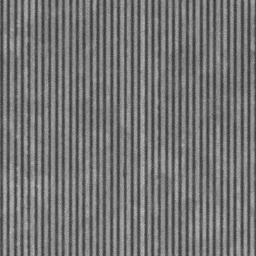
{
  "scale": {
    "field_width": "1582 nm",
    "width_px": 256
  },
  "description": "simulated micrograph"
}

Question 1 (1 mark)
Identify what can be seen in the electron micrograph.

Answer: parallel lines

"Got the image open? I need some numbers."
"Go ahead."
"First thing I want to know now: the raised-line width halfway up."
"18.5 nm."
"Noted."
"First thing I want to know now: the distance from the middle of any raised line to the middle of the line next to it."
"42.5 nm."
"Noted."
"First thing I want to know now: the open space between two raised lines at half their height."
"3.62 px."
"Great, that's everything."